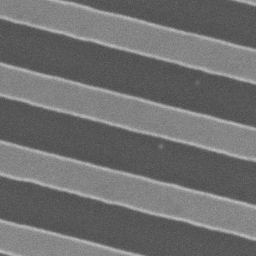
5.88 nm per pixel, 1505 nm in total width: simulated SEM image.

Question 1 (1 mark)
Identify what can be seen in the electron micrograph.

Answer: lines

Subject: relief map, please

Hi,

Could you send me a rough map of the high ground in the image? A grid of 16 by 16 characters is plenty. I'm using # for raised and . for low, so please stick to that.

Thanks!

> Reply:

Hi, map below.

######..........
.#########......
.....#########..
.........#######
##...........###
######..........
..########......
......########..
..........######
###...........##
######..........
..#########.....
......#########.
..........######
###...........##
#######.........